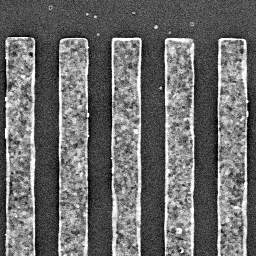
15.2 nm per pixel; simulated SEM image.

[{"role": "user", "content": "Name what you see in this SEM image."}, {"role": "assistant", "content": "wiring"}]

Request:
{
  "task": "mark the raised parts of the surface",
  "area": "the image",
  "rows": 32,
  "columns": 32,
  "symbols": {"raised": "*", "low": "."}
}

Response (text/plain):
................................
................................
................................
................................
................................
.***....***...****...***...****.
.***...****...****...***...****.
.***...****...****...***...***..
.***...****...***....***...***..
.***....***...***....***...***..
.***....***...***....***...****.
.***....***...***....***...****.
.***....***...***....***...****.
.***....***...***....***...****.
.***....***...***....***...****.
.***....***...***....***...****.
.***....***...***....***...****.
.***....***...***....***...****.
.***....***...***....***...****.
.***...****...***....***...****.
.***....***...***....***...****.
.***...****...***....***...****.
.***...****...***....***...****.
.***....***...***....***...****.
.***...****...***....***...****.
.***...****...***....***...***..
.***....***...***....***...***..
.***....***...***....***...****.
.***....***...***....***...****.
.***...****...***....***...****.
.***...****...***....***...***..
.***....***...***....***...****.